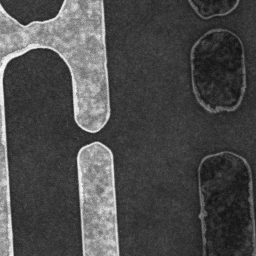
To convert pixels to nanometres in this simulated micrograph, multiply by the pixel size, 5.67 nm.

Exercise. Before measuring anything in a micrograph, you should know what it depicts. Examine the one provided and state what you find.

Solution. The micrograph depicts one or a few lines or trenches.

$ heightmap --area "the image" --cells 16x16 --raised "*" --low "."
....**......***.
*.****..........
*******......**.
*...***.....***.
....***.....***.
.....**.....***.
.....**......**.
.....**.........
................
.....**.........
.....**......***
*....**.....****
*....**......***
*....**......***
*....**......***
*....**......***